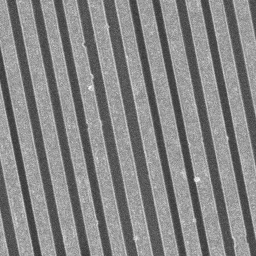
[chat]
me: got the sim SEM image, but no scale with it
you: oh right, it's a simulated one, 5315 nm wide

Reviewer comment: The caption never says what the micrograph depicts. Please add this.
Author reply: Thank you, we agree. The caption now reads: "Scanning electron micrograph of parallel lines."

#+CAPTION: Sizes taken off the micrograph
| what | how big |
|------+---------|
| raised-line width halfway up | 298 nanometres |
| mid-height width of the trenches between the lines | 204 nanometers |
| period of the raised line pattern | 490 nanometers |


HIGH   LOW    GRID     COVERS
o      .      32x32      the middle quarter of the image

...ooo...oooo...ooo...ooo..oooo.
o..oooo..oooo...oooo..ooo..oooo.
o..oooo...ooo...oooo..ooo...ooo.
o...ooo...ooo....ooo..oooo..oooo
o...ooo...oooo...ooo..oooo..oooo
o...ooo...oooo...ooo..oooo..oooo
oo..oooo..oooo...oooo..ooo..oooo
oo..oooo...ooo...oooo..ooo...ooo
oo...ooo...ooo....ooo..oooo..ooo
oo...ooo...oooo...ooo..oooo..ooo
oo...ooo...oooo...ooo..oooo..ooo
ooo..oooo..oooo...oooo..ooo..ooo
ooo..oooo...ooo...oooo..ooo...oo
ooo...ooo...ooo....ooo..oooo..oo
ooo...ooo...oooo...ooo..oooo..oo
ooo...ooo...oooo...ooo..oooo..oo
oooo..oooo..oooo...oooo..ooo..oo
.ooo..oooo...ooo...oooo..ooo...o
.ooo..oooo...ooo....ooo..oooo..o
.ooo...ooo...ooo....ooo..oooo..o
.ooo...ooo...oooo...ooo..oooo..o
.oooo..ooo...oooo...ooo...ooo..o
..ooo..oooo...ooo...oooo..ooo...
..ooo...ooo...ooo....ooo..oooo..
..ooo...ooo...ooo....ooo..oooo..
..ooo...ooo...oooo...ooo..oooo..
...ooo..ooo...oooo...ooo...ooo..
...ooo..oooo...ooo...oooo..ooo..
...ooo..oooo...ooo....ooo..oooo.
o..ooo...ooo...ooo....ooo..oooo.
o..ooo...ooo...oooo...ooo..oooo.
o..oooo..ooo...oooo...ooo...ooo.